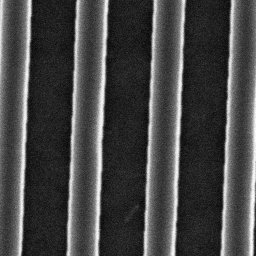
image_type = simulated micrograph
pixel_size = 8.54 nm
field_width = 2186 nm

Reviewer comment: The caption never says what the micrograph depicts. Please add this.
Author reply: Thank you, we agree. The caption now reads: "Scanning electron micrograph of lines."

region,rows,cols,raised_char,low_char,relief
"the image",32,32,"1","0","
11110000001110000001111000000111
11110000001110000001111000000111
11110000001110000001111000000111
11110000001110000001111000000111
11110000001110000001111000000111
11110000011110000001111000000111
11110000011110000001111000000111
11110000011110000001111000000111
11110000011110000001111000000111
11100000011110000001111000000111
11100000011110000001111000000111
11100000011110000001111000000111
11100000011110000001111000001111
11100000011110000001110000001111
11100000011110000001110000001111
11100000011110000001110000001111
11100000011110000001110000001111
11100000011110000001110000001111
11100000011110000001110000001111
11100000011110000001110000001111
11100000011110000001110000001111
11100000011110000011110000001111
11100000011100000011110000001111
11100000011100000011110000001111
11100000011100000011110000001111
11100000011100000011110000001111
11100000011100000011110000001111
11100000011100000011110000001111
11100000011100000011110000001111
11100000011100000011110000001111
11100000011100000011110000001110
11100000111100000011110000001110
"